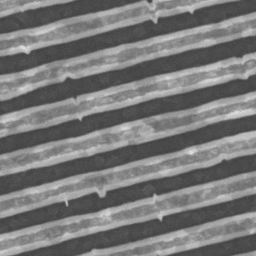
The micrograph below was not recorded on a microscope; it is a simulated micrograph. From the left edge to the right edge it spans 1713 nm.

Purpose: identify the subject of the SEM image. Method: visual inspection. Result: parallel lines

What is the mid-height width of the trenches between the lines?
149 nm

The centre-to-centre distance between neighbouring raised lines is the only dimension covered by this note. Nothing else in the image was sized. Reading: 258 nm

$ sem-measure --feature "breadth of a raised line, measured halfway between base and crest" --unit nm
108